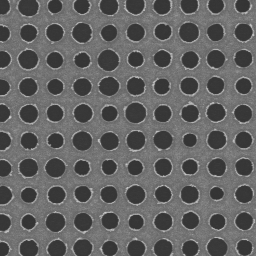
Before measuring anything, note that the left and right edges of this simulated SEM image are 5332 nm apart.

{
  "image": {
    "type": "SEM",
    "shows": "a regular array of holes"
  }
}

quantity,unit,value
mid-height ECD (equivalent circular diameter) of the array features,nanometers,364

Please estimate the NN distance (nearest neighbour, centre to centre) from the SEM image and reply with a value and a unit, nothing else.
549 nm